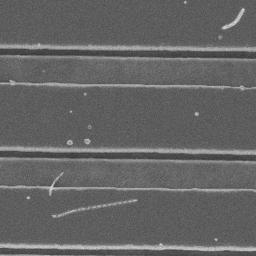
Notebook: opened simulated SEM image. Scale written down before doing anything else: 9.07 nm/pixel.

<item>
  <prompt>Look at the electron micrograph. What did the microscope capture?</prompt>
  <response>lines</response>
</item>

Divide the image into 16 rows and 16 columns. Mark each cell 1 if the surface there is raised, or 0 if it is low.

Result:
1111111111111111
1111111111111111
1111111111111111
0000000000000000
0000000000000000
1111111111111111
1111111111111111
1111111111111111
1111111111111111
0000000000011111
0000000000000000
0000000000000000
1111111111111111
1111111111111111
1111111111111111
0011111111111111